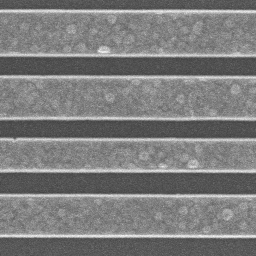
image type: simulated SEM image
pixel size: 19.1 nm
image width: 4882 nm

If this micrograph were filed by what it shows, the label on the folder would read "one or a few lines or trenches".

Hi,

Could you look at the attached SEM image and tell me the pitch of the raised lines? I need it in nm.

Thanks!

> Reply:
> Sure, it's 1160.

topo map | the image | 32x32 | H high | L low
LLLLLLLLLLLLLLLLLLLLLLLLLLLLLLLL
HHHHHHHHHHHHHHHHHHHHHHHHHHHHHHLL
HHHHHHHHHHHHHHHHHHHHHHHHHHHHHHHH
HHHHHHHHHHHHHHHHHHHHHHHHHHHHHHHH
HHHHHHHHHHHHHHHHHHHHHHHHHHHHHHHH
HHHHHHHHHHHHHHHHHHHHHHHHHHHHHHHH
HHHHHHHHHHHHHHHHHHHHHHHHHHHHHHHH
LLLLLLLLLLLLLLLLLLLLLLLLLLLLLLLL
LLLLLLLLLLLLLLLLLLLLLLLLLLLLLLLL
LLLLLLLLLLLLLLLLLLLLLLLLLLLLLLLL
HHHHHHHHHHHHHHHHHHHHHHHHHHHHHHHH
HHHHHHHHHHHHHHHHHHHHHHHHHHHHHHHH
HHHHHHHHHHHHHHHHHHHHHHHHHHHHHHHH
HHHHHHHHHHHHHHHHHHHHHHHHHHHHHHHH
HHHHHHHHHHHHHHHHHHHHHHHHHHHHHHHH
LLLLLLLLLLLLLLLLLLLLLLLLLLLLLLLL
LLLLLLLLLLLLLLLLLLLLLLLLLLLLLLLL
HHHHHHHHHHHHHHHHHHHHHHHHHHHHHHHH
HHHHHHHHHHHHHHHHHHHHHHHHHHHHHHHH
HHHHHHHHHHHHHHHHHHHHHHHHHHHHHHHH
HHHHHHHHHHHHHHHHHHHHHHHHHHHHHHHH
LLLLLLLLLLLLLLLLLLLLLLLLLLLLLLLL
LLLLLLLLLLLLLLLLLLLLLLLLLLLLLLLL
LLLLLLLLLLLLLLLLLLLLLLLLLLLLLLLL
HHHHHHHHHHHHHHHLLLLLLLLLLLLLLLLL
HHHHHHHHHHHHHHHHHHHHHHHHHHHHHHHH
HHHHHHHHHHHHHHHHHHHHHHHHHHHHHHHH
HHHHHHHHHHHHHHHHHHHHHHHHHHHHHHHH
HHHHHHHHHHHHHHHHHHHHHHHHHHHHHHHH
LLLHHHHHHHHLLLLLLLLLLLLLLLHHHHHL
LLLLLLLLLLLLLLLLLLLLLLLLLLLLLLLL
LLLLLLLLLLLLLLLLLLLLLLLLLLLLLLLL